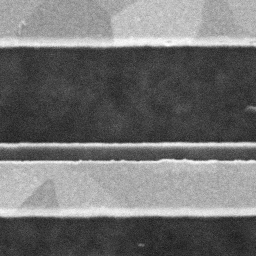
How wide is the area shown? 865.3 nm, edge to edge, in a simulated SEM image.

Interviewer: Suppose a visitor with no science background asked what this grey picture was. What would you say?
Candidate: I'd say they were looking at lines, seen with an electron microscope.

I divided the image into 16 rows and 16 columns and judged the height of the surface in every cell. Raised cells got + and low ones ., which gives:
++++++++++++++++
++++++++++++++++
++++++++++++++++
................
................
................
................
................
................
++++++++++++++++
++++++++++++++++
++++++++++++++++
++++++++++++++++
................
................
................